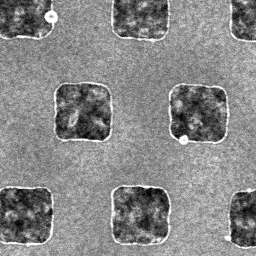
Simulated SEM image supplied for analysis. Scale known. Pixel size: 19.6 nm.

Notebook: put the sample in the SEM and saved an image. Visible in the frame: holes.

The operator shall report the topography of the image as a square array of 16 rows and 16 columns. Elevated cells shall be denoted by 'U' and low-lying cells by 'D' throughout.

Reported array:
DDDUUUUDDDDUUUDD
DDDUUUUDDDUUUUDD
UUUUUUUUUUUUUUUD
UUUUUUUUUUUUUUUU
UUUUUUUUUUUUUUUU
UUUUDDDUUUUDDDUU
UUUDDDDUUUUDDDUU
UUUDDDDUUUUDDDUU
UUUUDDDUUUUDDDUU
UUUUUUUUUUUUUUUU
UUUUUUUUUUUUUUUU
UUUUUUUUUUUUUUUU
DDDUUUUDDDDUUUDD
DDDUUUUDDDDUUUDD
DDDUUUUDDDUUUUDD
UUUUUUUUUUUUUUUU